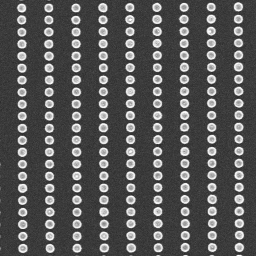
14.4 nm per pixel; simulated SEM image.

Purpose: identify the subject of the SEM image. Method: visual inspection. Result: a regular array of raised bodies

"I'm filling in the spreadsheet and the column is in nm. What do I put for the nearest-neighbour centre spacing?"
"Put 172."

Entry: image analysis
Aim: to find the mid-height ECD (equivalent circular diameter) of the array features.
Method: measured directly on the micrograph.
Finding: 121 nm